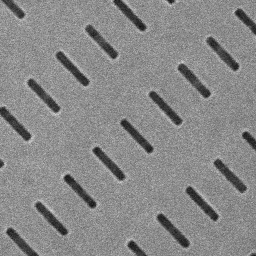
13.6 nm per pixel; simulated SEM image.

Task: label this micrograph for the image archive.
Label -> a regular array of holes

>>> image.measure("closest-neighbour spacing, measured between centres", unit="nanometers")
536